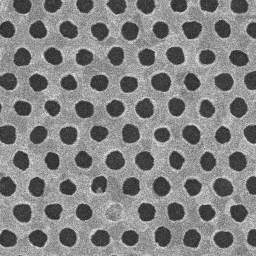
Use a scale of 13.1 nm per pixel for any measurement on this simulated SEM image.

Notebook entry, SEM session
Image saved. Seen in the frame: a regular array of holes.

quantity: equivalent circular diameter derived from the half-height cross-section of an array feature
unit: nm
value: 243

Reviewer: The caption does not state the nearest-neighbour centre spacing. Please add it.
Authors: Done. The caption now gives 29.1 pixels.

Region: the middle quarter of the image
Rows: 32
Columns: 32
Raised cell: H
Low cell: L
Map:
HHHHHHHHHHHHLLHHHHHHLHHHHHHHHHHH
HHHHHHHHHHHHHHHHHHHHHHHHHHHHHHHH
LLHHHHHHLLHHHHHHHHHHHHHLLLHHHHHL
LLLHHHHLLLLHHHLLLLHHHHLLLLLHHHLL
LLLHHHHLLLLHHHLLLLHHHHLLLLLHHHLL
LLLHHHLLLLLHHHLLLLHHHHLLLLLHHHLL
LLLHHHHLLLHHHHLLLLHHHHHLLLHHHHHL
HHHHHHHHHHHHHHHHHHHHHHHHHHHHHHHH
HHHHHHHHHHHHHHHHHHHHHHHHHHHLLHHH
HHHHLLHHHHHLLLLHHHLLLLHHHHLLLLHH
HHHLLLLHHHHLLLLHHHLLLLLHHHLLLLHH
HHHLLLLLHHHLLLLHHHLLLLLHHHLLLLHH
HHHLLLLHHHHLLLLHHHLLLLHHHHHLLHHH
HHHHLLHHHHHHLHHHHHHLLHHHHHHHHHHH
HHHHHHHHHHHHHHHHHHHHHHHHHHHHHHHH
LLLHHHHLLLHHHHHLLLHHHHHHHHHHHHLL
LLLHHHHLLLLHHHLLLLLHHHHLLLHHHLLL
LLLLHHLLLLLHHHLLLLLHHHLLLLLHHLLL
LLLHHHHLLLLHHHHLLLLHHHLLLLLHHHLL
LLLHHHHHLHHHHHHLLLHHHHHLLLHHHHHL
HHHHHHHHHHHHHHHHHHHHHHHHHHHHHHHH
HHHHHHHHHHHHLLHHHHHHHHHHHHHHHHHH
HHHLLLHHHHHLLLLHHHLLLLHHHHHLLLHH
HHHLLLLHHHLLLLLHHHLLLLHHHHLLLLHH
HHHLLLLHHHLLLLLHHHLLLLHHHHLLLLHH
HHHLLLLHHHHLLLLHHHLLLLHHHHHLLLHH
HHHHHHHHHHHHLLHHHHHHLHHHHHHHLHHH
HHHHHHHHHHHHHHHHHHHHHHHHHHHHHHHH
HHHHHHHHLLHHHHHHLLHHHHHLLHHHHHHL
LLHHHHHLLLLHHHHLLLLHHHLLLLHHHHLL
LLLHHHHLLLLHHHHLLLLHHHLLLLLHHHLL
LLLHHHHLLLHHHHHLLLLHHHLLLLLHHHLL